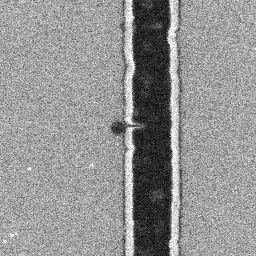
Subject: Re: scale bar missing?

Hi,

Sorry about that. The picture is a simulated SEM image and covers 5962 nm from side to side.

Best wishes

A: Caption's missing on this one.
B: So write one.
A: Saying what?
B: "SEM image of one or a few lines or trenches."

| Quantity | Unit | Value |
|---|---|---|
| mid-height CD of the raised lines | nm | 1120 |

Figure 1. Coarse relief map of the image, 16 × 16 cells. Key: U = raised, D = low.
DDDDDDDDUUUDDDDD
DDDDDDDDUUUDDDDD
DDDDDDDDUUUDDDDD
DDDDDDDDUUUDDDDD
DDDDDDDDUUUDDDDD
DDDDDDDDUUUDDDDD
DDDDDDDDUUUDDDDD
DDDDDDDDUUUDDDDD
DDDDDDDDUUUDDDDD
DDDDDDDDUUUDDDDD
DDDDDDDDUUUDDDDD
DDDDDDDDUUUDDDDD
DDDDDDDDUUUDDDDD
DDDDDDDDUUUDDDDD
DDDDDDDDUUUDDDDD
DDDDDDDDUUUDDDDD